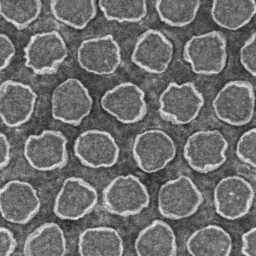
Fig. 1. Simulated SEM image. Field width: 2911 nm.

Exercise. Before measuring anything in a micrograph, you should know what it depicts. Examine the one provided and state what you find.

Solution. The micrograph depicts a regular array of raised bodies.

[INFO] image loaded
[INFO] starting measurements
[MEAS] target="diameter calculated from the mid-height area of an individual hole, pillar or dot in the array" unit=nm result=457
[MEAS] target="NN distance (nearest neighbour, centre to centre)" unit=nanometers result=603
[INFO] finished